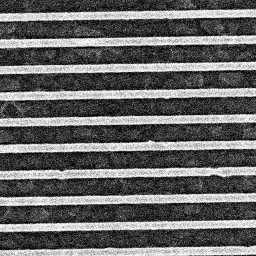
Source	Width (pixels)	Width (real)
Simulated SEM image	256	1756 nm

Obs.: parallel lines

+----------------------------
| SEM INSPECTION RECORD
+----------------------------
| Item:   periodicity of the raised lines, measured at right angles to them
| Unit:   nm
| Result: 181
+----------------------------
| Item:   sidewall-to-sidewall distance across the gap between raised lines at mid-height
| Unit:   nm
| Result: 127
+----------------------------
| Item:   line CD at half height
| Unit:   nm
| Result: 51.5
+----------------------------